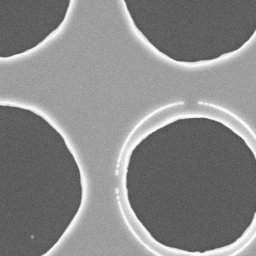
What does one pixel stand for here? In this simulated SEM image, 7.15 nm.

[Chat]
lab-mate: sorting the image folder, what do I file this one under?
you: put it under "holes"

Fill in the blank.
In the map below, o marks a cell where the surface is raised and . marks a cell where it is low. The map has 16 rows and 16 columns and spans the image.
....oooo........
....oooo........
...oooooo.......
.ooooooooo....oo
oooooooooooooooo
oooooooooooooooo
oooooooooooooooo
...oooooooo..ooo
....ooooo......o
....oooo........
.....ooo........
.....ooo........
.....ooo........
.....oooo.......
....ooooo......o
...oooooooo...oo